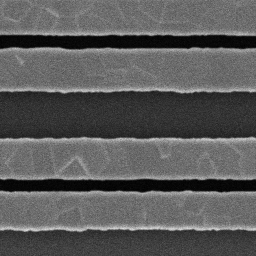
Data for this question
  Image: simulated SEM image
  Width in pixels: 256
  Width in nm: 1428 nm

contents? lines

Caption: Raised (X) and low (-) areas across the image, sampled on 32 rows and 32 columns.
XXXXXXXXXXXXXXXXXXXXXXXXXXXXXXXX
XXXXXXXXXXXXXXXXXXXXXXXXXXXXXXXX
XXXXXXXXXXXXXXXXXXXXXXXXXXXXXXXX
XXXXXXXXXXXXXXXXXXXXXXXXXXXXXXXX
--------------------------------
--------------------------------
XXXXXXXXXXXXXXXXXXXXXXXXXXXXXXXX
XXXXXXXXXXXXXXXXXXXXXXXXXXXXXXXX
XXXXXXXXXXXXXXXXXXXXXXXXXXXXXXXX
XXXXXXXXXXXXXXXXXXXXXXXXXXXXXXXX
XXXXXXXXXXXXXXXXXXXXXXXXXXXXXXXX
--------X-------------XX--------
--------------------------------
--------------------------------
--------------------------------
--------------------------------
--------------------------------
XXXXXXXXXXXXXXXXXXXXXXXXXXXXXXXX
XXXXXXXXXXXXXXXXXXXXXXXXXXXXXXXX
XXXXXXXXXXXXXXXXXXXXXXXXXXXXXXXX
XXXXXXXXXXXXXXXXXXXXXXXXXXXXXXXX
XXXXXXXXXXXXXXXXXXXXXXXXXXXXXXXX
------------X-------------------
--------------------------------
XXXXXXXXXXXXXXXXXXXXXXXXXXXXXXXX
XXXXXXXXXXXXXXXXXXXXXXXXXXXXXXXX
XXXXXXXXXXXXXXXXXXXXXXXXXXXXXXXX
XXXXXXXXXXXXXXXXXXXXXXXXXXXXXXXX
XXXXXXXXXXXXXXXXXXXXXXXXXXXXXXXX
--------------------------------
--------------------------------
--------------------------------